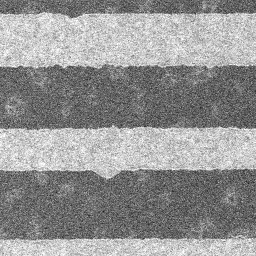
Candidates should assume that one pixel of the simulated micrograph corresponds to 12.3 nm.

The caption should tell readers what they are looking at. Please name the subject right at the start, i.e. one or a few lines or trenches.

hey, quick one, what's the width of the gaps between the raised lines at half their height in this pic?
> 794 nm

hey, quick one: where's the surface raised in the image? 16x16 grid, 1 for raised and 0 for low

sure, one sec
0000000000000000
1111111111111111
1111111111111111
1111111111111111
0000000000000000
0000000000000000
0000000000000000
0000000000000000
1111111111111111
1111111111111111
1111111111111111
0000000000000000
0000000000000000
0000000000000000
0000000000000000
1111111111111111